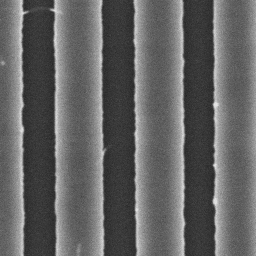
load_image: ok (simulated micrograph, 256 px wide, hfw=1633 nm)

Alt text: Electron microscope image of lines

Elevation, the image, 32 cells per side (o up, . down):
ooo....oooooo....oooooo....ooooo
ooo....oooooo....oooooo....ooooo
ooo....oooooo....oooooo....ooooo
ooo....oooooo....oooooo....ooooo
ooo....oooooo....oooooo....ooooo
ooo....oooooo....oooooo....ooooo
ooo....oooooo....oooooo....ooooo
ooo....oooooo....oooooo....ooooo
ooo....oooooo....oooooo....ooooo
ooo....oooooo....oooooo....ooooo
ooo....oooooo....oooooo....ooooo
ooo....oooooo....oooooo....ooooo
ooo....oooooo....oooooo....ooooo
ooo....oooooo....oooooo....ooooo
ooo....oooooo....oooooo....ooooo
ooo....oooooo....oooooo....ooooo
ooo....oooooo....oooooo....ooooo
ooo....oooooo....oooooo....ooooo
ooo....oooooo....oooooo....ooooo
ooo....oooooo....oooooo....ooooo
ooo....oooooo....oooooo....ooooo
ooo....oooooo....oooooo....ooooo
ooo....oooooo....oooooo....ooooo
ooo....oooooo....oooooo....ooooo
ooo....oooooo....oooooo....ooooo
ooo....oooooo....oooooo....ooooo
ooo....oooooo....oooooo....ooooo
ooo....oooooo....oooooo....ooooo
ooo....oooooo....oooooo....ooooo
ooo....oooooo....oooooo....ooooo
ooo....oooooo....oooooo....ooooo
ooo....oooooo....oooooo....ooooo